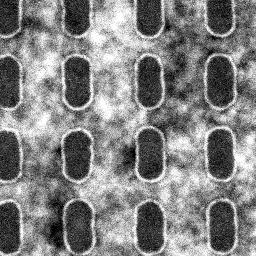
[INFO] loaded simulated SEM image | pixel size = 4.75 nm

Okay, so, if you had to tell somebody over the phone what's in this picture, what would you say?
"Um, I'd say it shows a regular array of raised bodies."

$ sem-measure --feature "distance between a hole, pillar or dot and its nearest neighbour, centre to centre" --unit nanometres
337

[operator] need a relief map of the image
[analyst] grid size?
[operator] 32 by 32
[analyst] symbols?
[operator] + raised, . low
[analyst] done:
+++.....+++......+++......+++...
+++.....++++.....+++......+++...
++......+++......+++......+++...
+++.....+++......+++......+++...
+........+........++.......+....
................................
................................
++......+++......+++......+++...
+++.....+++......+++......+++...
+++.....+++......+++......+++...
+++.....+++......+++......+++...
+++.....+++......+++......+++...
+++.....+++......+++......+++...
++.......+........+........+....
................................
................................
++.......++......+++......+++...
++......+++......+++......+++...
+++.....++++.....++++.....+++...
+++.....++++.....++++.....++++..
+++.....+++......++++.....++++..
+++.....+++......+++......+++...
++.......++.......++.......++...
................................
................................
++......+++.......++......+++...
+++.....++++.....+++......+++...
+++.....++++.....++++.....+++...
+++.....++++.....++++.....++++..
+++.....++++.....++++.....++++..
+++.....++++.....++++.....+++...
++.......++.......++.......++...